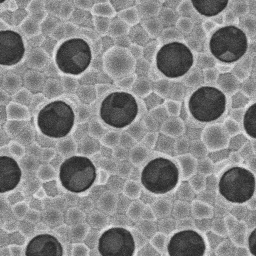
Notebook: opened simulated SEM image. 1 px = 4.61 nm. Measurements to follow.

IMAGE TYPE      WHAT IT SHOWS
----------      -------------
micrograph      a regular array of holes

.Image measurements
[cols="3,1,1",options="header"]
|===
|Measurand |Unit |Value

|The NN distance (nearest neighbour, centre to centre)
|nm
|270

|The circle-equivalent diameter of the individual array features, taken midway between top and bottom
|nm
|172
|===